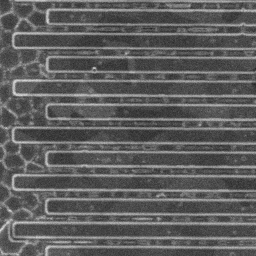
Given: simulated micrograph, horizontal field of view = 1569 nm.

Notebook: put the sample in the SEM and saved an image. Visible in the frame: parallel lines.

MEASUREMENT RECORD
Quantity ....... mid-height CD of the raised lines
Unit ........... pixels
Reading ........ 14.7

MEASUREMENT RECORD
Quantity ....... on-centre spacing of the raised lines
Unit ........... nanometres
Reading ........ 145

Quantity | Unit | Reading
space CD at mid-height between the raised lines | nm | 54.4